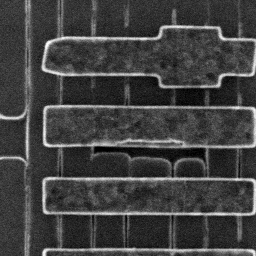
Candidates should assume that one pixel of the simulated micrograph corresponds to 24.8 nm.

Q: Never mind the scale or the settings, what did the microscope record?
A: wiring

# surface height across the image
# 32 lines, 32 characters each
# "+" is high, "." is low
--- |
................................
................................
................................
....................+++++++.....
....................++++++++....
......++++++++++++++++++++++++++
......++++++++++++++++++++++++++
.....+++++++++++++++++++++++++++
......++++++++++++++++++++++++++
...................+++++++++....
....................+++++++.....
................................
................................
......+++++++++++++++++++.......
......++++++++++++++++++++++++++
......++++++++++++++++++++++++++
......++++++++++++++++++++++++++
......++++++++++++++++++++++++++
................................
................................
................................
................................
......+++++++++++++++++++++++++.
......++++++++++++++++++++++++++
......++++++++++++++++++++++++++
......++++++++++++++++++++++++++
......++++++++++++++++++++++++++
................................
................................
................................
................................
......++++++++++++++++++++++++++